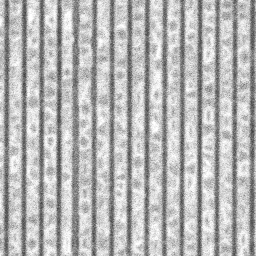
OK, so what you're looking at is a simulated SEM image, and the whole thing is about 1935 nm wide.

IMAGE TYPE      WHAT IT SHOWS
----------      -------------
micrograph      parallel lines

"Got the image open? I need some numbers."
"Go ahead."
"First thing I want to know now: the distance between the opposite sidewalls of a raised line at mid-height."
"89.8 nanometers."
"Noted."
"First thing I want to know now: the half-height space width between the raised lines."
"41.6 nm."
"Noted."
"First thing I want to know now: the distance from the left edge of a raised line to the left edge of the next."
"133 nm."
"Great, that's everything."